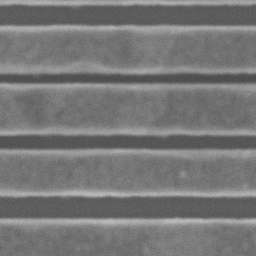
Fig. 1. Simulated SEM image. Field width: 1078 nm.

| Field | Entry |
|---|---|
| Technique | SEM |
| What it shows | lines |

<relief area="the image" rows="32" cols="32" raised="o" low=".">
................................
................................
................................
oo..oooooooooooooo.....ooooooooo
oooooooooooooooooooooooooooooooo
oooooooooooooooooooooooooooooooo
oooooooooooooooooooooooooooooooo
oooooooooooooooooooooooooooooooo
oooooooooooooooooooooooooooooooo
................................
................................
oooooooooooooooooooooooooooooooo
oooooooooooooooooooooooooooooooo
oooooooooooooooooooooooooooooooo
oooooooooooooooooooooooooooooooo
oooooooooooooooooooooooooooooooo
oooooooooooooooooooooooooooooooo
................................
................................
oooooooooooooooooooooooooooooooo
oooooooooooooooooooooooooooooooo
oooooooooooooooooooooooooooooooo
oooooooooooooooooooooooooooooooo
oooooooooooooooooooooooooooooooo
................................
................................
................................
................................
oooooooooooooooooooooooooooooooo
oooooooooooooooooooooooooooooooo
oooooooooooooooooooooooooooooooo
oooooooooooooooooooooooooooooooo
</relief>